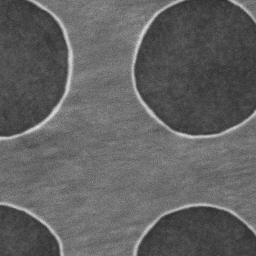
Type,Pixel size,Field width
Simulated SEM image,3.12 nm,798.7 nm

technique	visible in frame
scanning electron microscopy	holes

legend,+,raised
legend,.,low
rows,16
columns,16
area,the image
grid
...+++++++.....+
....+++++.......
....+++++.......
....++++........
....++++........
....+++++.......
....+++++.......
...+++++++.....+
.+++++++++++.+++
++++++++++++++++
++++++++++++++++
++++++++++++++++
++++++++++++++++
..++++++++.....+
...++++++.......
....+++++.......